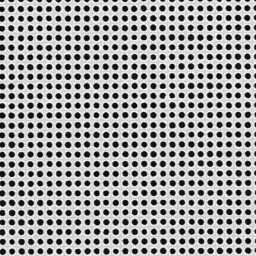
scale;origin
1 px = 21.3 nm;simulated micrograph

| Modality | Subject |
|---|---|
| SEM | a regular array of holes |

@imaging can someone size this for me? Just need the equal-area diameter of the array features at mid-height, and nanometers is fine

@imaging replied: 140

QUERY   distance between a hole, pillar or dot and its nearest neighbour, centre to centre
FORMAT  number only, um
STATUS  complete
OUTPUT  0.196